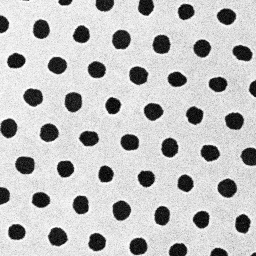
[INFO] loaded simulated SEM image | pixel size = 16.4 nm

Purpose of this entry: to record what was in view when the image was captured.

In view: a regular array of holes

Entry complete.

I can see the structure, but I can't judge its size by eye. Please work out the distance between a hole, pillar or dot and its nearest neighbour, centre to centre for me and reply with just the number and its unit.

39 px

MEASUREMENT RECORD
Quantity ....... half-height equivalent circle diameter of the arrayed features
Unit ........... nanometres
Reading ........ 303